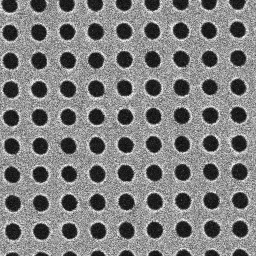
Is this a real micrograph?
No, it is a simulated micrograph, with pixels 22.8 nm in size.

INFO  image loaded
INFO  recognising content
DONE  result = a regular array of holes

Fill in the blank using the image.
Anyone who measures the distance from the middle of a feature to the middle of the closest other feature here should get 644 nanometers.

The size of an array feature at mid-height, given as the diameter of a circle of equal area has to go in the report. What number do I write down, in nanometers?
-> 381